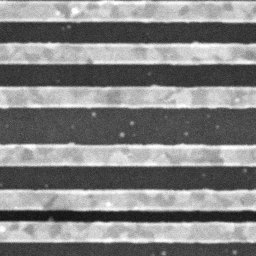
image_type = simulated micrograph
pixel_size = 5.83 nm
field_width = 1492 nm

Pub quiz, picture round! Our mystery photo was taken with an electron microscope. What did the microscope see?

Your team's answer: lines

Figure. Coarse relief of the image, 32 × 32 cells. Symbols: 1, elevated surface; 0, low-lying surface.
11111111111111111111111111111111
11111111111111111111111111111111
11111111111111111111111111111111
00000000000000000000000000000000
00000000000000000000000000000000
00000000000000000000000000000000
11111111111111111111111111111111
11111111111111111111111111111111
00000000000000000000000000000000
00000000000000000000000000000000
00000000000000000000000000000000
11111111111111111111111111111111
11111111111111111111111111111111
00000000000000000000000000000000
00000000000000000000000000000000
00000000000000000000000000000000
00000000000000000000000000000000
00000000000000000000000000000000
11111111111111111111111111111111
11111111111111111111111111111111
11111111111111111111111111111111
00000000000000000000000000000000
00000000000000000000000000000000
00000000000000000000000000000000
11111111111111111111111111111111
11111111111111111111111111111111
00000000000000000000000000000000
00000000000000000000000000000000
11111111111111111111111111111111
11111111111111111111111111111111
00000000000000000000000000000000
00000000000000000000000000000000